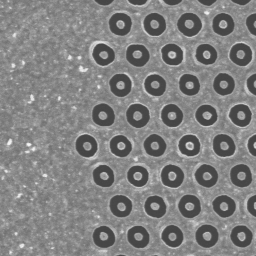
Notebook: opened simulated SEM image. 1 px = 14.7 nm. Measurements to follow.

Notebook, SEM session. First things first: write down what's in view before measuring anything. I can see a regular array of ring-shaped grooves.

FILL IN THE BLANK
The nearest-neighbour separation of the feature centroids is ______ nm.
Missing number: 504